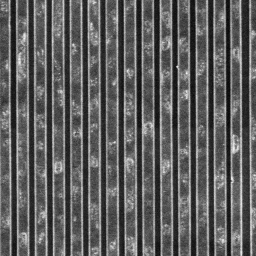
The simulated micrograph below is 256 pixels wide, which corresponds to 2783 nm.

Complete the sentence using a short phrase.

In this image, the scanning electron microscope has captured parallel lines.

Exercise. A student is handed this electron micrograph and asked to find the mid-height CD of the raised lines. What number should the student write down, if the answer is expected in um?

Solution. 0.124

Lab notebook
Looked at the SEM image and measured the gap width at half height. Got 67.9 nm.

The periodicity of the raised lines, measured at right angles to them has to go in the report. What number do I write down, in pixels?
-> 17.8